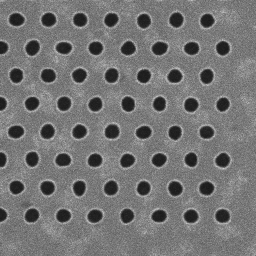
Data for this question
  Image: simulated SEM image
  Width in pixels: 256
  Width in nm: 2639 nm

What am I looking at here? a regular array of holes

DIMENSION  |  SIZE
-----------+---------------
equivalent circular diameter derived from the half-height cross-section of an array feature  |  145 nm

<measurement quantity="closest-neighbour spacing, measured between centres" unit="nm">322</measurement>